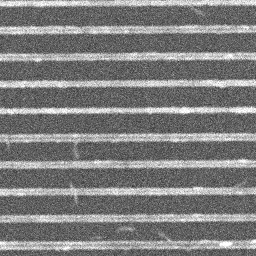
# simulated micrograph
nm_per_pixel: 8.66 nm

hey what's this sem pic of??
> parallel lines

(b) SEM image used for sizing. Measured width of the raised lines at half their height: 6.12 pixels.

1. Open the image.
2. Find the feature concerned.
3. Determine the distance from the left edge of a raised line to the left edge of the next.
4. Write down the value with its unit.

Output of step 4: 0.233 µm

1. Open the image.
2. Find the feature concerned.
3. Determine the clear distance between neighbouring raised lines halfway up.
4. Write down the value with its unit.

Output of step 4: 183 nm